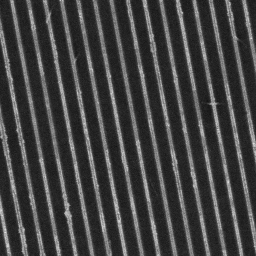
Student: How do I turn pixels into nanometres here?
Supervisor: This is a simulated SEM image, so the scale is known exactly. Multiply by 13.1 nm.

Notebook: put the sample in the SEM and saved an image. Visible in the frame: parallel lines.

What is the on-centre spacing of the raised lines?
0.213 um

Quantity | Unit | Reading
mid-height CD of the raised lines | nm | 56.2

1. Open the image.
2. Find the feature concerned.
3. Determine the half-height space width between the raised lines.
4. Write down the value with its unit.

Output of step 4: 159 nm